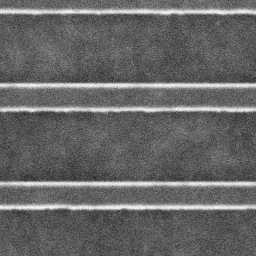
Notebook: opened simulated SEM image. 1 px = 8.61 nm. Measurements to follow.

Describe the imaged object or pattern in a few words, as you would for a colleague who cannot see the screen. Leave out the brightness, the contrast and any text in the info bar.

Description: lines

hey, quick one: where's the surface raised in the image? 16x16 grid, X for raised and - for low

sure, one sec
XXXXXXXXXXXXXXXX
----------------
----------------
----------------
----------------
XXXXXXXXXXXXXXXX
XXXXXXXXXXXXXXXX
----------------
----------------
----------------
----------------
XXXXXXXXXXXXXXXX
XXXXXXXXXXXXXXXX
----------------
----------------
----------------